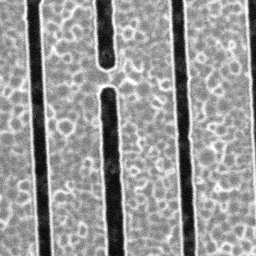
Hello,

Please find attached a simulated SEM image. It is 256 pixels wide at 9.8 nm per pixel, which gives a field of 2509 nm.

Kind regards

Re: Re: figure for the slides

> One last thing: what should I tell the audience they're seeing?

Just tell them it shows one or a few lines or trenches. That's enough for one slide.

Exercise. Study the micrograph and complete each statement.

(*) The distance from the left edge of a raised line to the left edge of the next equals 0.707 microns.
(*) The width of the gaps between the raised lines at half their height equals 553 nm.